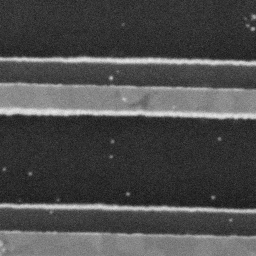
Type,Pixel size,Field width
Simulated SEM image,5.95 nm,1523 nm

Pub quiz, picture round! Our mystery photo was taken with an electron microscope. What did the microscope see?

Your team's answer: lines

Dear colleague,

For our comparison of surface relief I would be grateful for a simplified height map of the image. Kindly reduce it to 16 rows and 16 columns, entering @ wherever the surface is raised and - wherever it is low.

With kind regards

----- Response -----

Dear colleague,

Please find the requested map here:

----------------
----------------
----------------
----------------
@@@@@@@@@@@@@@@@
@@@@@@@@@@@@@@@@
@@@@@@@@@@@@@@@@
----------------
----------------
----------------
----------------
----------------
----------------
@@@@@@@@@@@@@@@@
@@@@@@@@@@@@@@@@
@@@@@@@@@@@@@@@@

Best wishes